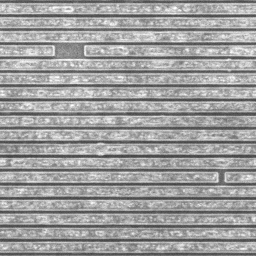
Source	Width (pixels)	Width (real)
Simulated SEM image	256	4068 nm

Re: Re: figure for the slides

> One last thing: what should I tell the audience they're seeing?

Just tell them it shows parallel lines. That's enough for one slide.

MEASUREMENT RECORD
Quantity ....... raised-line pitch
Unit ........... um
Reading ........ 0.223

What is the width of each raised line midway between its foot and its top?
167 nanometers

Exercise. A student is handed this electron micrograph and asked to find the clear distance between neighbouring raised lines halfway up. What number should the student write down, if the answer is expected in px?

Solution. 3.88